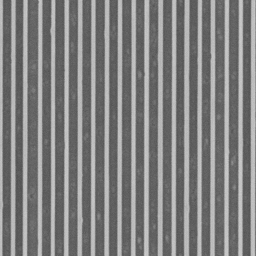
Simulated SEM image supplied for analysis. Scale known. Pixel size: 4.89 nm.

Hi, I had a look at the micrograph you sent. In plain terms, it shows parallel lines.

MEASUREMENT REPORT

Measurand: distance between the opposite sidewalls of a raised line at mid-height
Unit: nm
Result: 17.7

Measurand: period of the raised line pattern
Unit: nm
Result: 65.1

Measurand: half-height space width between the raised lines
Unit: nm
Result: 44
